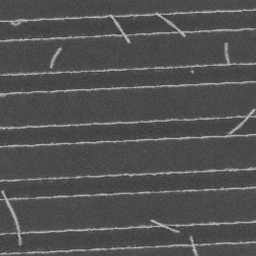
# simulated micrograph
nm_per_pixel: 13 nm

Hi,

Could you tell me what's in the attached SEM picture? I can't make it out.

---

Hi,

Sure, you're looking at lines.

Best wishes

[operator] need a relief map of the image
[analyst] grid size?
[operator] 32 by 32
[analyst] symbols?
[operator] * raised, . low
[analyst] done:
********************************
***************************.....
******..........................
................................
.............*******************
********************************
********************************
********************************
*******************.............
................................
........................********
...*****************************
********************************
********************************
********************************
************....................
................................
.................***************
********************************
********************************
********************************
*************************.......
***.............................
..............................**
.........***********************
********************************
********************************
********************************
*****************...............
................................
...........................*****
......**************************